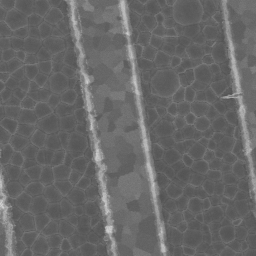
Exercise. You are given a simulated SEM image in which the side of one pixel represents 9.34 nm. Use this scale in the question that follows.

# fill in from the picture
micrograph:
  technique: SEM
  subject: one or a few lines or trenches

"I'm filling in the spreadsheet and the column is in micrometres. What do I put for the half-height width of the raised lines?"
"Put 0.462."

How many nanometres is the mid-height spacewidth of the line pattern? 932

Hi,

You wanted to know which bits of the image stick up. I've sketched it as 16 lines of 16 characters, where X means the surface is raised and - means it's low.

-----XXX------XX
-----XXX------XX
-----XXX------XX
-----XXX-------X
-----XXX-------X
-----XXXX------X
------XXX------X
------XXX------X
------XXX------X
------XXX-------
------XXX-------
------XXXX------
-------XXX------
-------XXX------
X------XXX------
X------XXX------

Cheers